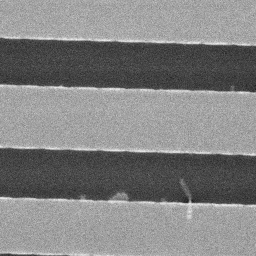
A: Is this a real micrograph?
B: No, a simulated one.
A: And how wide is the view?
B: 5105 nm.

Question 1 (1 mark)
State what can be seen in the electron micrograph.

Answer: lines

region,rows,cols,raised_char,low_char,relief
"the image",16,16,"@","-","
@@@@@@@@@@@@@@@@
@@@@@@@@@@@@@@@@
-----@@@@@@@@@@@
----------------
----------------
@@@@@@----------
@@@@@@@@@@@@@@@@
@@@@@@@@@@@@@@@@
@@@@@@@@@@@@@@@@
----------@@@@@@
----------------
----------------
@@@@@-----------
@@@@@@@@@@@@@@@@
@@@@@@@@@@@@@@@@
@@@@@@@@@@@@@@@@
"